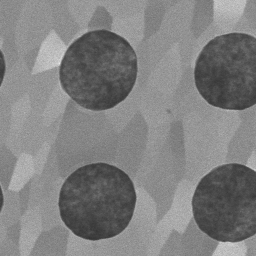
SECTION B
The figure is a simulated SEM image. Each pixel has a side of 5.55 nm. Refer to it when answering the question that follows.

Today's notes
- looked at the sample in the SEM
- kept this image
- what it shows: holes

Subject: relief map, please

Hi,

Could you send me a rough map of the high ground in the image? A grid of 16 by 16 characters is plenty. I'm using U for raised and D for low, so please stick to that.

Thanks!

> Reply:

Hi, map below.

UUUUUUUUUUUUUUUU
UUUUUUUUUUUUUUUU
UUUUUDDDUUUUUDDD
UUUUDDDDUUUUDDDD
UUUUDDDDDUUUDDDD
UUUUDDDDUUUUDDDD
UUUUUDDUUUUUUDDD
UUUUUUUUUUUUUUUU
UUUUUUUUUUUUUUUU
UUUUUUUUUUUUUUUU
UUUUUDDUUUUUUUDD
UUUUDDDDUUUUDDDD
UUUUDDDDDUUUDDDD
UUUUDDDDUUUUDDDD
UUUUUDDDUUUUUDDD
UUUUUUUUUUUUUUUU